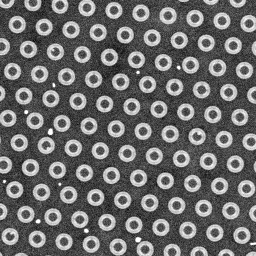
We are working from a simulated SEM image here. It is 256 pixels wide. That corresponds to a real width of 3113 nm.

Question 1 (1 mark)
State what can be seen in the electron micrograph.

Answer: an array of small figures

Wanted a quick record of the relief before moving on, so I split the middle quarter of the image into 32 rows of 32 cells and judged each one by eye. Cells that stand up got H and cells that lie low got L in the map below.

LLLLLLLLLLLLLLLLLHHLLLLHHHHLLLHH
HHLLLLLLLLLLLLLLLLLLLLLLHHLLLLHH
HHHLLLHHHLLLLLLLLLLLLLLLLLLLLLLL
HHHLLHHHHLLLHHHHLLLLHHLLLLLLLLLL
HHLLLHHHHLLLHHHHLLLHHHHLLLHHHLLL
LLLLLLHHLLLLHHHHLLLHHHHLLLHHHHLL
LLLLLLLLLLLLLLLLLLLHHHLLLLHHHHLL
LLLHLLLLLLLLLLLLLLLLLLLLLLLHHLLL
LLHHHLLLLHHHLLLLLLLLLLLLLLLLLLLL
LLHHHLLLHHHHLLLHHHHLLLLHHLLLLLLL
LLHHHLLLHHHHLLLHHHHLLLHHHHLLLHHH
LLLLLLLLLHHLLLLHHHHLLLHHHHLLLHHH
LLLLLLLLLLLLLLLLHHLLLLHHHLLLLHHH
HLLLLLLLLLLLLLLLLLLLLLLLLLLLLHHH
HLLLLHHHLLLLHHLLLLLLLLLLLLLLLLLL
HLLLHHHHLLLHHHHLLLHHHLLLLLLLLLLL
HLLLHHHHLLLHHHHLLLHHHHLLLHHHLLLL
LLLLLLLLLLLHHHHLLLHHHHLLLHHHHLLH
LLLLLLLLLLLLLLLLLLLHHLLLLHHHLLLH
LHHHLLLLLLLLLLLLLLLLLLLLLLLLLLLL
HHHHLLLHHHHLLLLHHLLLLLLLLLLLLLLL
HHHHLLLHHHHLLLHHHHLLLHHHLLLLLLLL
LHHHLLLHHHHLLLHHHHLLLHHHLLLLHHHL
LLLLLLLLHHLLLLHHHLLLLHHHLLLHHHHL
LLLLLLLLLLLLLLLLLLLLLHHHLLLHHHHL
LLLLHHLLLLLLLLLLLLLLLLLLLLLLHHLL
LLLHHHHLLLHHHLLLLLLLLLLLLLLLLLLL
LLLHHHHLLLHHHHLLLHHHLLLLHHLLLLLL
LLLLHHHLLLHHHHLLLHHHHLLHHHHLLLLH
LLLLLLLLLLLHHLLLLHHHLLLHHHHLLLHH
LLLLLLLLLLLLLLLLLLHLLLLLHHHLLLHH
HHHLLLLHHLLLLLLLLLLLLLLLLLLLLLLH